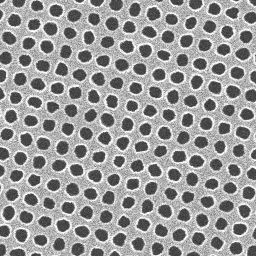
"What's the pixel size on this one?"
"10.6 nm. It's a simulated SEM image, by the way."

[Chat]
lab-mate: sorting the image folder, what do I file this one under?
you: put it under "a regular array of holes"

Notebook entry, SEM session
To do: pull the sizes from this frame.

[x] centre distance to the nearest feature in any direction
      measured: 195 nm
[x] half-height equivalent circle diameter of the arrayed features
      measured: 135 nm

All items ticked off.